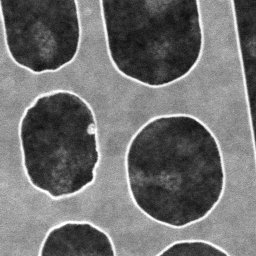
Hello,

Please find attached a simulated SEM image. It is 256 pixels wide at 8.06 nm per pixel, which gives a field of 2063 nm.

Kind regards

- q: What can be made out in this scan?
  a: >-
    one or a few lines or trenches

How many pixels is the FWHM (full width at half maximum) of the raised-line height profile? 36.5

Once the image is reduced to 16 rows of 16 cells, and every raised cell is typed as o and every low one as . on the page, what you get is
.....o......ooo.
.....oo......oo.
.....oo......oo.
o....oo.....ooo.
oooooooo....ooo.
ooooooooooooooo.
oo...oooooooooo.
o.....oooo..oooo
o.....oo.....ooo
o.....oo......oo
oo....oo......oo
oo....oo......oo
oooooooo......oo
ooooooooo....ooo
ooo...oooooooooo
ooo....oooo...oo